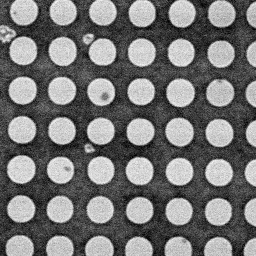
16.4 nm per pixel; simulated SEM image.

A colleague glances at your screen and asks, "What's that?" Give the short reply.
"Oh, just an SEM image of an array of small figures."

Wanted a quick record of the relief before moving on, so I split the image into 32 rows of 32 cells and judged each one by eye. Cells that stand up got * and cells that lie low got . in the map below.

..**...**...**...**...**...**...
.****.***..***..***..***..***..*
..**...**...**..***..***..***..*
*...............................
*...............................
.***..***...**..***..***...**...
.****.***..***..***..***..***..*
..**...**...**..***..***..***..*
................................
................................
.***..***..***..***..***..***..*
.***..***..***..***..***..***..*
..**...**..***..***..***..***..*
................................
................................
.***..***..***..***..***..***..*
.***..***..***..***..***..***..*
..**...**..***..***..***..***..*
................................
................................
.***..***..***..***..***..**...*
.***..***..***..***..***..***..*
..**...**...**..***..***..***..*
................................
................................
.***..***..***..***..***..***..*
.***..***..***..***..***..***..*
..*....*....*...***..***..***..*
................................
................................
.***..***..***..***..***..***..*
.***..***..***..***..***..***..*